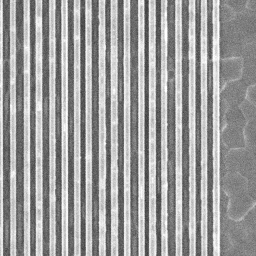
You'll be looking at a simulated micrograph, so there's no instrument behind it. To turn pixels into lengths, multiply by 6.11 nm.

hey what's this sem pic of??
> parallel lines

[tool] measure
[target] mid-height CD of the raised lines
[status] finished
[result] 31.3 nm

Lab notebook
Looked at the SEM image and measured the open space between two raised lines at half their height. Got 42 nm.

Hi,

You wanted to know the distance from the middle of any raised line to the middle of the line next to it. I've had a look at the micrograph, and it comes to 77.7 nm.